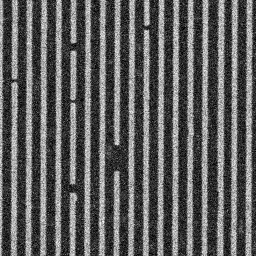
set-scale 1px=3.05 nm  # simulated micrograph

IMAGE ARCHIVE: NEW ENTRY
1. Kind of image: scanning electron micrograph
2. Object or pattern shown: parallel lines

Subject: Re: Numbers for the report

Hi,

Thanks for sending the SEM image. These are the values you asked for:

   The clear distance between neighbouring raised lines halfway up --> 29.8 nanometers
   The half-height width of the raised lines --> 16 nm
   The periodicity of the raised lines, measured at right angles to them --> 14.7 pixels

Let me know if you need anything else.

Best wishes